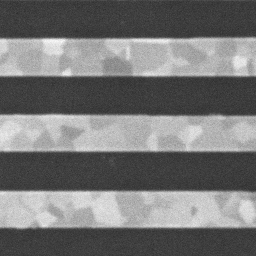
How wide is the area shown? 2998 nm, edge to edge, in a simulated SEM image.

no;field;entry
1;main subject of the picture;lines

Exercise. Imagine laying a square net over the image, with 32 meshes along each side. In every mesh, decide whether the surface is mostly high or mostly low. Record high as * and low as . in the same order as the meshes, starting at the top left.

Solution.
................................
................................
................................
................................
................................
********************************
********************************
********************************
********************************
................................
................................
................................
................................
................................
*****************...............
********************************
********************************
********************************
********************************
................................
................................
................................
................................
................................
********************************
********************************
********************************
********************************
................................
................................
................................
................................